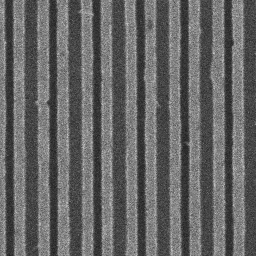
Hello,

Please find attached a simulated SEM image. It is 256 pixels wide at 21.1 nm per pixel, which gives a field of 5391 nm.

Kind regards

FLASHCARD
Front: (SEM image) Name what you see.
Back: parallel lines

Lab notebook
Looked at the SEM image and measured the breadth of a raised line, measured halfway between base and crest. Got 0.242 micrometres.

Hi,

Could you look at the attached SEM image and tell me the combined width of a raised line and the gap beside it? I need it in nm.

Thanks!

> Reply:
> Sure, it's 461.